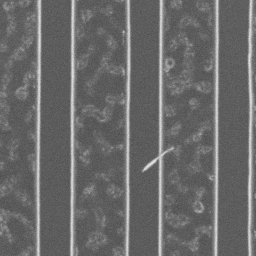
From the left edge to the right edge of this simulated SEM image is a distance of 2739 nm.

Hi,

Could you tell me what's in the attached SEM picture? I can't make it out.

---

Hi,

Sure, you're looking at one or a few lines or trenches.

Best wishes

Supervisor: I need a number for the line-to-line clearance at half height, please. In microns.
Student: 0.603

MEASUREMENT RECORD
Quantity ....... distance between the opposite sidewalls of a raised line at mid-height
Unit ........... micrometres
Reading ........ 0.352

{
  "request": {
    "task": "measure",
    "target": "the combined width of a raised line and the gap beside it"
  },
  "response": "951 nm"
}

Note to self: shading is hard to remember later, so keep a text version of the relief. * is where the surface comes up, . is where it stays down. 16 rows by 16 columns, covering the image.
...**...**....**
...**...**....**
...**...**....**
..***...**....**
..***...**....**
..***...**....**
..**....**....**
..**....**....**
..**....**....**
..***...**....**
..***...**....**
..***...**....**
..***...**....**
..**....**....**
..**....**....**
..**....**...***